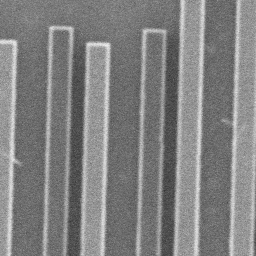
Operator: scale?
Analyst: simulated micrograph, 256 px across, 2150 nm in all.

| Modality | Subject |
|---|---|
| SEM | parallel lines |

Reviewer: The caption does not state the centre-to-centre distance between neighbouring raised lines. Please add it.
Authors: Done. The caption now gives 0.382 micrometres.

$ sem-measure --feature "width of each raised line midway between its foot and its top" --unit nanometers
175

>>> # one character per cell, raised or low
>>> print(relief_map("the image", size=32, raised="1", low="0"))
00000000000000000000000110000011
00000000000000000000000110000011
00000000000000000000000110000011
00000000000000000000000110000011
00000011100000000011100110000011
11000011100000000011000110000011
11000011100111000011000110000011
11000011100111000011000110000011
11000011100110000011000110000011
11000011100110000011000110000011
11000011100110000011000110000011
11000011100110000011001110000011
11000011100110000011001110000111
11000011100110000011001110000111
11000011100110000011001110000111
11000011100110000011001110000111
11000011000110000011001110000111
11000011100110000011001110000111
11000011100110000011001110000111
11000011100110000011001110000111
11000011000110000011001110000111
10000011001110000011001110000111
10000011001110000011001110000111
10000011001110000011001110000111
10000011001110000111001110000111
10000011001110000111001110000111
10000011001110000111001110000111
10000011001110000111001110000111
10000011001110000111001110000111
10000011001110000111001110000111
10000011001110000111001110000110
10000011001110000111001110000110